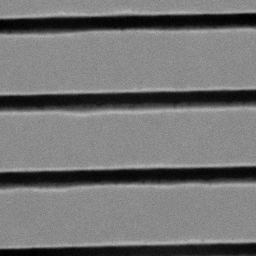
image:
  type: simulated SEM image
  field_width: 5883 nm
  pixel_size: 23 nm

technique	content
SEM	lines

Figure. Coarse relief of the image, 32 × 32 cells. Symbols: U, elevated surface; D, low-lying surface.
UUUUUUUUUUUUUUUUUUUUUUUUUUUUUUUU
UUUUUUUUUUUUUUUUUUUUUUUUUUUUUUUU
DDDDDDDDDDDDDDDDDDDDDDDDDDDDDDDD
DDDDDDDDDDDDDDDDDDDDDDDDDDDUUUUU
UUUUUUUUUUUUUUUUUUUUUUUUUUUUUUUU
UUUUUUUUUUUUUUUUUUUUUUUUUUUUUUUU
UUUUUUUUUUUUUUUUUUUUUUUUUUUUUUUU
UUUUUUUUUUUUUUUUUUUUUUUUUUUUUUUU
UUUUUUUUUUUUUUUUUUUUUUUUUUUUUUUU
UUUUUUUUUUUUUUUUUUUUUUUUUUUUUUUU
UUUUUUUUUUUUUUUUUUUUUUUUUUUUUUUU
UUUUUUUUUUUUUUUUUUUDDDDDDDDDDDDD
DDDDDDDDDDDDDDDDDDDDDDDDDDDDDDDD
DDDDDDDDDDDDDDDDDDDUUUUUUUUUUUUU
UUUUUUUUUUUUUUUUUUUUUUUUUUUUUUUU
UUUUUUUUUUUUUUUUUUUUUUUUUUUUUUUU
UUUUUUUUUUUUUUUUUUUUUUUUUUUUUUUU
UUUUUUUUUUUUUUUUUUUUUUUUUUUUUUUU
UUUUUUUUUUUUUUUUUUUUUUUUUUUUUUUU
UUUUUUUUUUUUUUUUUUUUUUUUUUUUUUUU
UUUUUUUUUUUUUUUUUUUUUUUUUUUUUUUU
DDDDDDDDDDDDDDDDDDDDDDDDDDDDDDDD
DDDDDDDDDDDDDDDDDDDDDDDDDDDDDDDD
UUUUUUUUUUUUUUUUUUUUUUUUUUUUUUUU
UUUUUUUUUUUUUUUUUUUUUUUUUUUUUUUU
UUUUUUUUUUUUUUUUUUUUUUUUUUUUUUUU
UUUUUUUUUUUUUUUUUUUUUUUUUUUUUUUU
UUUUUUUUUUUUUUUUUUUUUUUUUUUUUUUU
UUUUUUUUUUUUUUUUUUUUUUUUUUUUUUUU
UUUUUUUUUUUUUUUUUUUUUUUUUUUUUUUU
UUUUUUUUUUUUUUUUUUUUUUUUUUDDDDDD
DDDDDDDDDDDDDDDDDDDDDDDDDDDDDDDD